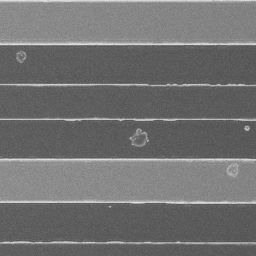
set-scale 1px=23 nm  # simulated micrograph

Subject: lines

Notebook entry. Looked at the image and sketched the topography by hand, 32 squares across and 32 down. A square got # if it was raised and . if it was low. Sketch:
################################
################################
################################
################################
################################
#########.....################.#
................................
................................
................................
................................
................................
################################
################################
################################
################################
................................
................................
................................
................................
................................
################################
################################
################################
################################
################################
................................
................................
................................
................................
................................
################################
################################